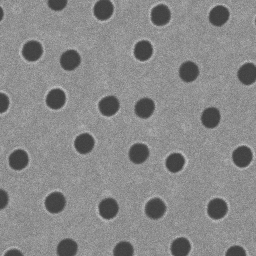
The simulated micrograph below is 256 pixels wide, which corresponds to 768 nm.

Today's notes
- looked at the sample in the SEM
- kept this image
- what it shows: a regular array of holes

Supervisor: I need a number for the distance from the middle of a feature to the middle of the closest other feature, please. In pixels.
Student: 44.8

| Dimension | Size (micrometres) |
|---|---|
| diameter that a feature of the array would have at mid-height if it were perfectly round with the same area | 0.0577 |